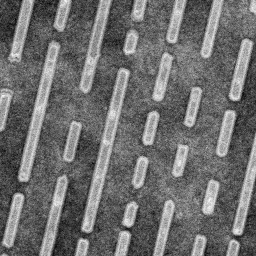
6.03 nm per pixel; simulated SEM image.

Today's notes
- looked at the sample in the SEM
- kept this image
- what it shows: parallel lines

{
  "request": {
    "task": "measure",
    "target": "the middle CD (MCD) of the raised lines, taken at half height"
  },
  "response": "9.25 px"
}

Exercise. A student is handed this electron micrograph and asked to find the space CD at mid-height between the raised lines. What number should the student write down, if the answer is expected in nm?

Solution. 172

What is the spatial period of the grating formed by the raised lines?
0.223 micrometres